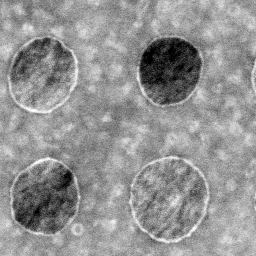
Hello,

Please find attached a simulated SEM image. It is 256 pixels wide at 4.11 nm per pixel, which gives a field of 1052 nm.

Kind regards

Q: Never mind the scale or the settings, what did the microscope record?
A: raised bodies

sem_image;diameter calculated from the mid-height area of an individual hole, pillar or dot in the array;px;72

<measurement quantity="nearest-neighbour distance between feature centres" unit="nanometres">508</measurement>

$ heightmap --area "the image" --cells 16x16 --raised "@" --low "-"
----------------
----------------
--@@------@@----
-@@@@----@@@@---
-@@@@----@@@@---
-@@@@----@@@----
-@@@------@-----
----------------
----------------
----------------
--@@-----@@@----
-@@@@---@@@@@---
-@@@@---@@@@@---
-@@@@---@@@@@---
--@@-----@@@----
----------------